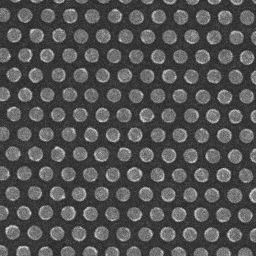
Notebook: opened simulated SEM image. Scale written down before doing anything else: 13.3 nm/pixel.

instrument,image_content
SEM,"a regular array of raised bodies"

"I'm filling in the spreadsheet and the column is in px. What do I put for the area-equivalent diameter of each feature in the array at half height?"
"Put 13.9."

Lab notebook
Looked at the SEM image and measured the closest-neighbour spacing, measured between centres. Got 292 nm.